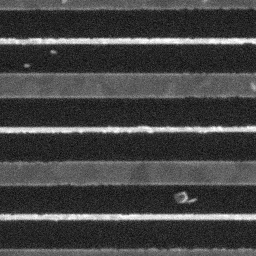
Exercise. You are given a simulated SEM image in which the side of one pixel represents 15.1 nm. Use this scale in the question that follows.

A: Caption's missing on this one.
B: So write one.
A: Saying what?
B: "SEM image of lines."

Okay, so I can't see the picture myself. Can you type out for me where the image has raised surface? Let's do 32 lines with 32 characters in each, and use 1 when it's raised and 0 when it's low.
11111111111111111111111111111111
00000000000000000000000000000000
00000000000000000000000000000000
00000000000000000000000000000000
00000000000000000000000000000000
00000000000000000000000000000000
00000000000000000000000000000000
00000000000000000000000000000000
00000000000000000000000000000000
11111111111111111111111111111111
11111111111111111111111111111111
11111111111111111111111111111111
00000000000000000000000000000000
00000000000000000000000000000000
00000000000000000000000000000000
00000000000000000000000000000000
00000000000000000000000000000000
00000000000000000000000000000000
00000000000000000000000000000000
00000000000000000000000000000000
11111111111111111111111111111111
11111111111111111111111111111111
11111111111111111111111111111111
00000000000000000000000000000000
00000000000000000000001000000000
00000000000000000000000000000000
00000000000000000000000000000000
00000000000000000000000000000000
00000000000000000000000000000000
00000000000000000000000000000000
00000000000000000000000000000000
11111111111111111111111111111111